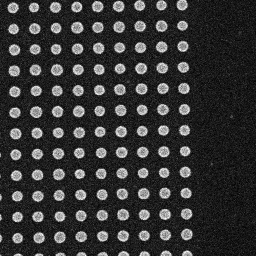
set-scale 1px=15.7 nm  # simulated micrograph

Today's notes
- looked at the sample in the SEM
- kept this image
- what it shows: a regular array of raised bodies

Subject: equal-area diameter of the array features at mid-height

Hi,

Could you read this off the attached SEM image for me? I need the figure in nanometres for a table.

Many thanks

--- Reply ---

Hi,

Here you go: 158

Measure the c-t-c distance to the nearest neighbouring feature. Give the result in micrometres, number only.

0.325